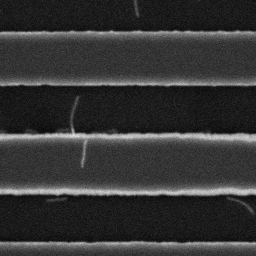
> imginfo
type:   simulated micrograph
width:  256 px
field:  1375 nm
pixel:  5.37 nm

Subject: lines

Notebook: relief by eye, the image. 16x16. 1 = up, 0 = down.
0000000000000000
0000000000000000
1111111111111111
1111111111111111
1111111111111111
0000000000000000
0000000000000000
0000000000000000
1111111111111111
1111111111111111
1111111111111111
1111111111111111
0000000000000000
0000000000000000
0000000000000000
1111111111111111